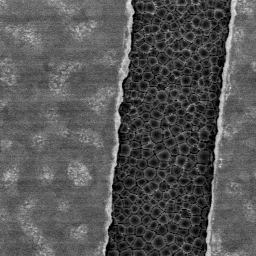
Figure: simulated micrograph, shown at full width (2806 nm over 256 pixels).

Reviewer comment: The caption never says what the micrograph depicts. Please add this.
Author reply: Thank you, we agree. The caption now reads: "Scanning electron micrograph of one or a few lines or trenches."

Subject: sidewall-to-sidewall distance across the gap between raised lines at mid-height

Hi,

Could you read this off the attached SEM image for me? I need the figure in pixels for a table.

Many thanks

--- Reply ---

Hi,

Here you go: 101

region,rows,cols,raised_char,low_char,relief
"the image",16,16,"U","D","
UUUUUUUUDDDDDDDU
UUUUUUUUDDDDDDUU
UUUUUUUUDDDDDDUU
UUUUUUUUDDDDDDUU
UUUUUUUUDDDDDDUU
UUUUUUUUDDDDDDUU
UUUUUUUDDDDDDDUU
UUUUUUUDDDDDDDUU
UUUUUUUDDDDDDDUU
UUUUUUUDDDDDDUUU
UUUUUUUDDDDDDUUU
UUUUUUUDDDDDDUUU
UUUUUUUDDDDDDUUU
UUUUUUUDDDDDDUUU
UUUUUUUDDDDDDUUU
UUUUUUUDDDDDDUUU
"